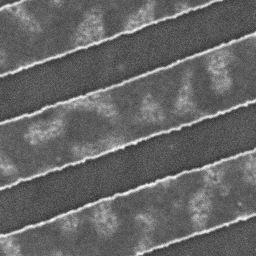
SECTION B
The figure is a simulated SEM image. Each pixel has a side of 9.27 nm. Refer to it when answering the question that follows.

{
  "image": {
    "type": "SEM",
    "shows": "one or a few lines or trenches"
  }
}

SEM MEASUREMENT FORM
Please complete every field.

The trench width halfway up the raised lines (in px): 44.7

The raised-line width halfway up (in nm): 566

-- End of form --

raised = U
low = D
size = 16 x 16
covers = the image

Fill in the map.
UUUUUUUUUUUUDDDD
UUUUUUUUUDDDDDDD
UUUUUUUDDDDDDDDU
UUUUDDDDDDDDUUUU
UDDDDDDDDUUUUUUU
DDDDDDDUUUUUUUUU
DDDDUUUUUUUUUUUD
DUUUUUUUUUUUUDDD
UUUUUUUUUUDDDDDD
UUUUUUUDDDDDDDDD
UUUUDDDDDDDDDUUU
UDDDDDDDDDUUUUUU
DDDDDDUUUUUUUUUU
DDDDUUUUUUUUUUUU
DUUUUUUUUUUUUDDD
UUUUUUUUUUDDDDDD